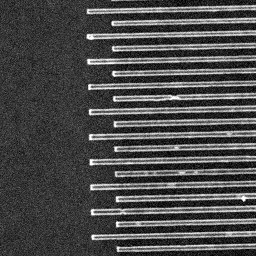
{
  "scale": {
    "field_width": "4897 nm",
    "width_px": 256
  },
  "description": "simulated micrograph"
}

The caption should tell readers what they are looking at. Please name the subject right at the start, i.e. parallel lines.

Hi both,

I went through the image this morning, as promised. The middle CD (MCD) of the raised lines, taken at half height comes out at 90.9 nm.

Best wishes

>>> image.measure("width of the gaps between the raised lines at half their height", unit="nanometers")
148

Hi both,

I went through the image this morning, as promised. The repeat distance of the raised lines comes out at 12.6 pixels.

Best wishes